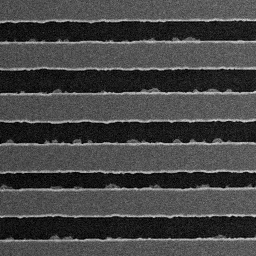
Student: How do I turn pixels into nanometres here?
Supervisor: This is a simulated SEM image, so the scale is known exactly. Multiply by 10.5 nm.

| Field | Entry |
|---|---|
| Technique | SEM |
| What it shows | lines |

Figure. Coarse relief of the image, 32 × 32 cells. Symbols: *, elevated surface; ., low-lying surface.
********************************
********************************
********************************
................................
................................
********************************
********************************
********************************
********************************
................................
................................
...............................*
********************************
********************************
********************************
................................
................................
................................
********************************
********************************
********************************
********************************
................................
................................
********************************
********************************
********************************
................................
................................
................................
********************************
********************************